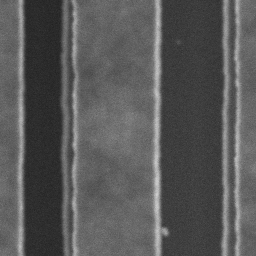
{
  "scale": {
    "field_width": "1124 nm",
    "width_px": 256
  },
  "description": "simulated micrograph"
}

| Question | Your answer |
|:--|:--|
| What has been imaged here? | lines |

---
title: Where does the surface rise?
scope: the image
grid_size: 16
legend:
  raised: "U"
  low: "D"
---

UDDDUUUUUUDDDDUU
UDDDUUUUUUDDDDUU
UDDDUUUUUUDDDDUU
UDDDUUUUUUDDDDUU
UDDDUUUUUUDDDDUU
UDDDUUUUUUDDDDUU
UDDDUUUUUUDDDDUU
UDDDUUUUUUDDDDUU
UDDDUUUUUUDDDDUU
UDDDUUUUUUDDDDUU
UDDDUUUUUUDDDDUU
UDDDUUUUUUDDDDUU
UDDDUUUUUUDDDDUU
UDDDUUUUUUDDDDUU
UDDDUUUUUUDDDDUU
UDDDUUUUUUDDDDUU